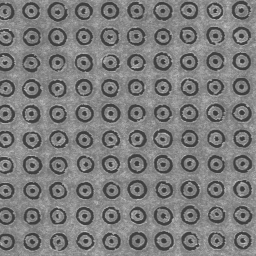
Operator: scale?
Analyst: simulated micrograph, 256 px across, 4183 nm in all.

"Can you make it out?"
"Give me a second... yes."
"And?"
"a regular array of ring-shaped grooves with a dot in the middle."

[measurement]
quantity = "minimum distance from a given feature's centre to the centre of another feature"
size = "417 nanometers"